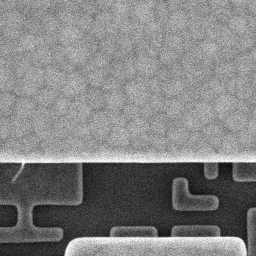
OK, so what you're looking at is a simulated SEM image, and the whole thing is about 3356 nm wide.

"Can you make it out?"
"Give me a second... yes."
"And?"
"wiring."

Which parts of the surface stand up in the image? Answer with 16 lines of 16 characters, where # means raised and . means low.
################
################
################
################
################
################
################
################
################
################
................
................
................
................
................
....###########.